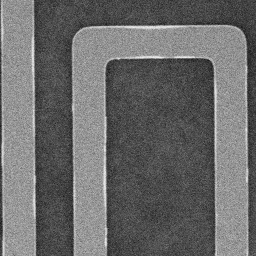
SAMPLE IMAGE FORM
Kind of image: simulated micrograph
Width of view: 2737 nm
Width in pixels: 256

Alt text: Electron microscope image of groups of lines, slits or small figures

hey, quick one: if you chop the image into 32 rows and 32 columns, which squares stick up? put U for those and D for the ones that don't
UUUUDDDDDDDDDDDDDDDDDDDDDDDDDDDD
UUUUDDDDDDDDDDDDDDDDDDDDDDDDDDDD
UUUUDDDDDDDDDDDDDDDDDDDDDDDDDDDD
UUUUDDDDDDDUUUUUUUUUUUUUUUUUUUDD
UUUUDDDDDUUUUUUUUUUUUUUUUUUUUUUD
UUUUDDDDDUUUUUUUUUUUUUUUUUUUUUUD
UUUUDDDDDUUUUUUUUUUUUUUUUUUUUUUD
UUUUDDDDDUUUUUDDDDDDDDDDDDUUUUUD
UUUUDDDDDUUUUDDDDDDDDDDDDDDUUUUD
UUUUDDDDDUUUUDDDDDDDDDDDDDDUUUUD
UUUUDDDDDUUUUDDDDDDDDDDDDDDUUUUD
UUUUDDDDDUUUUDDDDDDDDDDDDDDUUUUD
UUUUDDDDDUUUUDDDDDDDDDDDDDDUUUUD
UUUUDDDDDUUUUDDDDDDDDDDDDDDUUUUD
UUUUDDDDDUUUUDDDDDDDDDDDDDDUUUUD
UUUUDDDDDUUUUDDDDDDDDDDDDDDUUUUD
UUUUDDDDDUUUUDDDDDDDDDDDDDDUUUUD
UUUUDDDDDUUUUDDDDDDDDDDDDDDUUUUD
UUUUDDDDDUUUUDDDDDDDDDDDDDDUUUUD
UUUUDDDDDUUUUDDDDDDDDDDDDDDUUUUD
UUUUDDDDDUUUUDDDDDDDDDDDDDDUUUUD
UUUUDDDDDUUUUDDDDDDDDDDDDDDUUUUD
UUUUDDDDDUUUUDDDDDDDDDDDDDDUUUUD
UUUUDDDDDUUUUDDDDDDDDDDDDDDUUUUD
UUUUDDDDDUUUUDDDDDDDDDDDDDDUUUUD
UUUUDDDDDUUUUDDDDDDDDDDDDDDUUUUD
UUUUDDDDDUUUUDDDDDDDDDDDDDDUUUUD
UUUUDDDDDUUUUDDDDDDDDDDDDDDUUUUD
UUUUDDDDDUUUUDDDDDDDDDDDDDDUUUUD
UUUUDDDDDUUUUDDDDDDDDDDDDDDUUUUD
UUUUDDDDDUUUUDDDDDDDDDDDDDDUUUUD
UUUUDDDDDUUUUDDDDDDDDDDDDDDUUUUD